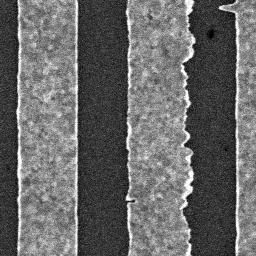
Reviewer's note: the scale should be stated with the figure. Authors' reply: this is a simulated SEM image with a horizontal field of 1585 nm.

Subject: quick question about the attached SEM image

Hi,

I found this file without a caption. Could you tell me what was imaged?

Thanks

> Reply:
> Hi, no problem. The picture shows one or a few lines or trenches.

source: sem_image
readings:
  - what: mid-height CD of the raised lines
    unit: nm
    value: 361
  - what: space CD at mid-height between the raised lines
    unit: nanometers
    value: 316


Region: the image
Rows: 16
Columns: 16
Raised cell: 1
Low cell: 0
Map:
0111100011110011
0111100011110001
0111100011110001
0111100011110001
0111100011110001
0111100011110001
0111100011110001
0111100011110001
0111100011110001
0111100011110001
0111100011110001
0111100011110001
0111100011110001
0111100011110001
0111100011110001
0111100011110001